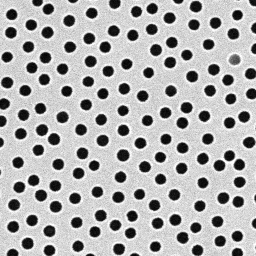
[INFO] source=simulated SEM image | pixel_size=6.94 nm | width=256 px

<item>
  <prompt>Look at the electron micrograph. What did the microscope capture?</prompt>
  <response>a regular array of holes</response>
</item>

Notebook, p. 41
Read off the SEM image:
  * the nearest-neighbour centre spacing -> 132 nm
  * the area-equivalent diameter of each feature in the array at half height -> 83.6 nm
